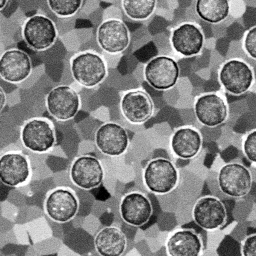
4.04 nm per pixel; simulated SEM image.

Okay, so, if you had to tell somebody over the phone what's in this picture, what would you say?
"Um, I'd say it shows a regular array of holes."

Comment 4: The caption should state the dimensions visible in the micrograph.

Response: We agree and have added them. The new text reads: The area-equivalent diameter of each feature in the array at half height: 130 nm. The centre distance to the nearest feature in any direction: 168 nanometres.